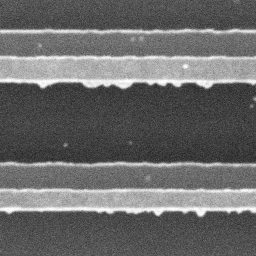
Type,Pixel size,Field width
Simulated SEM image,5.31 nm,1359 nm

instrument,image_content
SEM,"lines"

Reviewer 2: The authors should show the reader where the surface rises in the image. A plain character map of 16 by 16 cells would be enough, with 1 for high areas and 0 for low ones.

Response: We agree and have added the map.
0000000000000000
0000000000000000
1111111111111111
1111111111111111
1111111111111111
0000000000000000
0000000000000000
0000000000000000
0000000000000000
0000000000000000
1111111111111111
1111111111111111
1111111111111111
0000000000000000
0000000000000000
0000000000000000